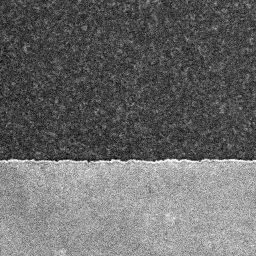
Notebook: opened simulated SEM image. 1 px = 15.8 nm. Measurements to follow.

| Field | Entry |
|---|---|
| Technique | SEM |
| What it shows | one or a few lines or trenches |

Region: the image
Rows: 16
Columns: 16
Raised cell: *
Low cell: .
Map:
................
................
................
................
................
................
................
................
................
................
****************
****************
****************
****************
****************
****************